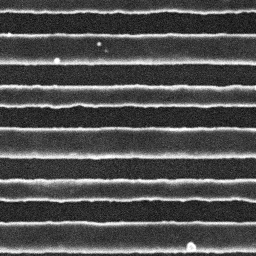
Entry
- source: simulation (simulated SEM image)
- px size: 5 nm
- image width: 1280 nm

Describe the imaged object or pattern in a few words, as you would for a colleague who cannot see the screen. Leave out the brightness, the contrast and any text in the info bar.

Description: lines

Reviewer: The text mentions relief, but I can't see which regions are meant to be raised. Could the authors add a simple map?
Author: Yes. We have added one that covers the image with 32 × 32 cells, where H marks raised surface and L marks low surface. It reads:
HHHHHHHHHHHHHHHHHHHHHHHHHHHHHHHH
HHHHHHHHHHHHHHHHHHHHLLHHHHHHHHHL
LLLLLLLLLLLLLLLLLLLLLLLLLLLLLLLL
LLLLLLLLLLLLLLLLLLLLLLLLLLLLLLLL
HHHHHHHHHHHHHHHHHHHHHHHHHHHHHHHH
HHHHHHHHHHHHHHHHHHHHHHHHHHHHHHHH
HHHHHHHHHHHHHHHHHHHHHHHHHHHHHHHH
HHHHHHHHHHHHHHHHHHHHHHHHHHHHHHHH
LLLLLLLLLLLLLLLLLLLLLLLLLLLLLLLL
LLLLLLLLLLLLLLLLLLLLLLLLLLLLLLLL
LLLLLLLLLLLLLLLLLLLLLLLLLLLLLLLL
HHHHHHHHHHHHHHHHHHHHHHHHHHHHHHHH
HHHHHHHHHHHHHHHHHHHHHHHHHHHHHHHH
LLLLLLLLLLLLLLLLLLLLLLLLLLLLLLLL
LLLLLLLLLLLLLLLLLLLLLLLLLLLLLLLL
LLLLLLLLLLLLLLLLLLLLLLLLLLLLLLLL
HHHHHHHHHHHHHHHHHHHHHHHHHHHHHHHH
HHHHHHHHHHHHHHHHHHHHHHHHHHHHHHHH
HHHHHHHHHHHHHHHHHHHHHHHHHHHHHHHH
HHHHHHHHHHHHHHHHHHHHHHHHHHHHHHHH
LLLLLLLLLLLLLLLLLLLLLLLLLLLLLLLL
LLLLLLLLLLLLLLLLLLLLLLLLLLLLLLLL
LLHLLLLLLLLLLLLLLLLLLLLLLHLLLLHH
HHHHHHHHHHHHHHHHHHHHHHHHHHHHHHHH
HHHHHHHHHHHHHHHHHHHHHHHHHHHHHHHH
LLLLLLLLLLLLLLLLLLLLLLLLLLLLLLLL
LLLLLLLLLLLLLLLLLLLLLLLLLLLLLLLL
LLLLLLLLLLLLLLLLLLLLLLLLLLLLLLLL
HHHHHHHHHHHHHHHHHHHHHHHHHHHHHHHH
HHHHHHHHHHHHHHHHHHHHHHHHHHHHHHHH
HHHHHHHHHHHHHHHHHHHHHHHHHHHHHHHH
LLLLLLLLLLLLLLLLLLLLLLLLLLLLLLLL